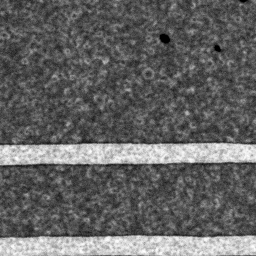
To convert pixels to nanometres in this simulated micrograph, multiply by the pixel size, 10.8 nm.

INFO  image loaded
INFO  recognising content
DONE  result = one or a few lines or trenches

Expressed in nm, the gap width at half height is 794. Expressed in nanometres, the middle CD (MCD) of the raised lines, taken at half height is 201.